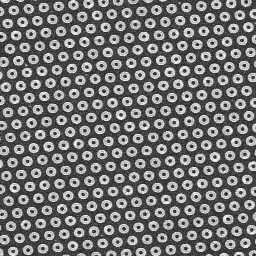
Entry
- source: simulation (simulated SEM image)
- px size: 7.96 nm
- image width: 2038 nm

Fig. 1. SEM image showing a regular array of ring-shaped raised bodies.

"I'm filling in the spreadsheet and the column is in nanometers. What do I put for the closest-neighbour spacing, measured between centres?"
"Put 116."